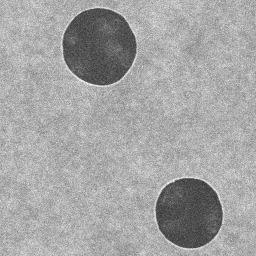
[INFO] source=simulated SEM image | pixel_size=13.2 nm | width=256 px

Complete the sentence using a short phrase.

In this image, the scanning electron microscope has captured holes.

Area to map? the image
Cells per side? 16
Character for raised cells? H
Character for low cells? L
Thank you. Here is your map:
HHHHHHHHHHHHHHHH
HHHHLLLLHHHHHHHH
HHHHLLLLHHHHHHHH
HHHHLLLLHHHHHHHH
HHHHHLLLHHHHHHHH
HHHHHHHHHHHHHHHH
HHHHHHHHHHHHHHHH
HHHHHHHHHHHHHHHH
HHHHHHHHHHHHHHHH
HHHHHHHHHHHHHHHH
HHHHHHHHHHHHHHHH
HHHHHHHHHHHLLHHH
HHHHHHHHHHLLLLHH
HHHHHHHHHHLLLLHH
HHHHHHHHHHLLLLHH
HHHHHHHHHHHHHHHH